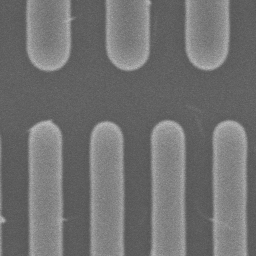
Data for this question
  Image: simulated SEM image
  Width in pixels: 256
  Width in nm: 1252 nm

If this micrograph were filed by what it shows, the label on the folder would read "groups of lines, slits or small figures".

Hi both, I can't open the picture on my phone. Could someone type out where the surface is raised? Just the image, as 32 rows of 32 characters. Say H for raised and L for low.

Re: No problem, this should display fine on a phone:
LLLHHHHHHLLLLHHHHHHLLLLHHHHHHLLL
LLLHHHHHHLLLLHHHHHHLLLLHHHHHHLLL
LLLHHHHHHLLLLHHHHHHLLLLHHHHHHLLL
LLLHHHHHHLLLLHHHHHHLLLLHHHHHHLLL
LLLHHHHHHLLLLHHHHHHLLLLHHHHHHLLL
LLLHHHHHHLLLLHHHHHHLLLLHHHHHLLLL
LLLLHHHHHLLLLHHHHHHLLLLHHHHHLLLL
LLLLHHHHLLLLLLHHHHLLLLLLHHHHLLLL
LLLLLHHLLLLLLLLHHLLLLLLLLHHLLLLL
LLLLLLLLLLLLLLLLLLLLLLLLLLLLLLLL
LLLLLLLLLLLLLLLLLLLLLLLLLLLLLLLL
LLLLLLLLLLLLLLLLLLLLLLLLLLLLLLLL
LLLLLLLLLLLLLLLLLLLLLLLLLLLLLLLL
LLLLLLLLLLLLLLLLLLLLLLLLLLLLLLLL
LLLLLLLLLLLLLLLLLLLLLLLLLLLLLLLL
LLLLLHHLLLLLLHLLLLLLHHLLLLLLHHLL
LLLLHHHLLLLLHHHLLLLHHHHLLLLHHHLL
LLLLHHHHLLLHHHHLLLLHHHHLLLLHHHHL
LLLLHHHHLLLHHHHLLLLHHHHLLLLHHHHL
LLLLHHHHLLLHHHHLLLLHHHHLLLLHHHHL
LLLLHHHHLLLHHHHLLLLHHHHLLLLHHHHL
LLLLHHHHLLLHHHHLLLLHHHHLLLLHHHHL
LLLLHHHHLLLHHHHLLLLHHHHLLLLHHHHL
LLLLHHHHLLLHHHHLLLLHHHHLLLLHHHHL
LLLLHHHHLLLHHHHLLLLHHHHLLLLHHHHL
LLLLHHHHLLLHHHHLLLLHHHHLLLLHHHHL
LLLLHHHHLLLHHHHLLLLHHHHLLLLHHHHL
LLLLHHHHLLLHHHHLLLLHHHHLLLLHHHHL
LLLLHHHHLLLHHHHLLLLHHHHLLLLHHHHL
LLLLHHHHLLLHHHHLLLLHHHHLLLLHHHHL
LLLLHHHHLLLHHHHLLLLHHHHLLLLHHHHL
LLLLHHHHLLLHHHHLLLLHHHHLLLLHHHHL